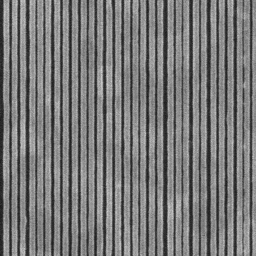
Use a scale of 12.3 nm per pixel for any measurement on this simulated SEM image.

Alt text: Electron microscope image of parallel lines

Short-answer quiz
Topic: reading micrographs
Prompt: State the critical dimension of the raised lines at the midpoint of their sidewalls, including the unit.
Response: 66.2 nanometres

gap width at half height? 33.8 nm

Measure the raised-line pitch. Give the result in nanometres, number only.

106